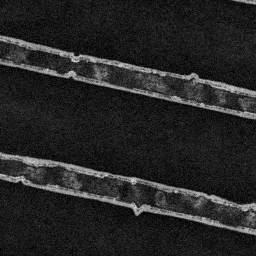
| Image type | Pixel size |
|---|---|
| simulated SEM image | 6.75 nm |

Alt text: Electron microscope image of one or a few lines or trenches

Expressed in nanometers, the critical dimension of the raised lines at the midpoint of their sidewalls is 179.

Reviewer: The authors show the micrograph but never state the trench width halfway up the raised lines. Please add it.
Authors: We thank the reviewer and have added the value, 579 nm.